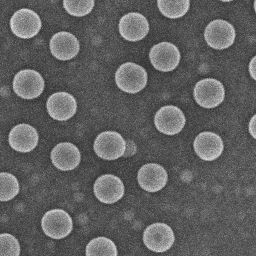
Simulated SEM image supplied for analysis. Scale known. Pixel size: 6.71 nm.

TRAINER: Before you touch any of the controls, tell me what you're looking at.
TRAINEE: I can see a regular array of raised bodies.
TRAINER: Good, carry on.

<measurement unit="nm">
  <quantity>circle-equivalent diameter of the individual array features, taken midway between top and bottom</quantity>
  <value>195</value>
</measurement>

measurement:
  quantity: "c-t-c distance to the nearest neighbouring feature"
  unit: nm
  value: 302